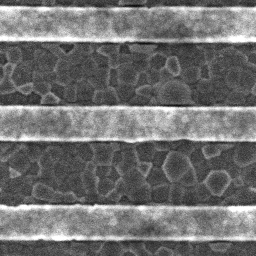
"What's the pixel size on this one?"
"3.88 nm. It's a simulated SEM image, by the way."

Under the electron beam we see one or a few lines or trenches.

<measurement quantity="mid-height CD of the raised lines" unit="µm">0.129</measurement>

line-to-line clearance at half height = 0.258 um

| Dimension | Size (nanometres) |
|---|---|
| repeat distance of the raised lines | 386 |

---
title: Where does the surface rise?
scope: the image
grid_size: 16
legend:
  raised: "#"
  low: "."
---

#####.....##....
################
..#############.
................
................
................
................
################
################
................
................
................
................
################
################
................